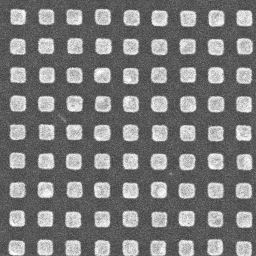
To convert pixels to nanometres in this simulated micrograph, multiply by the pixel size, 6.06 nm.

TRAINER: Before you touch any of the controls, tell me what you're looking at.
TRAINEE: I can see a regular array of raised bodies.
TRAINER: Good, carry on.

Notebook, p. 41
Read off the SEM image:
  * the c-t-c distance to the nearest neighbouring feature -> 170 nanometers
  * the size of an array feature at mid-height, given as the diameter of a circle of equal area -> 99.6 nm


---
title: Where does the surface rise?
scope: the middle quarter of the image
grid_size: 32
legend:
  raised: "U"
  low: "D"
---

DDDDDDDDDDDDDDDDDDDDDDDDDDDDDDDD
DUUUDDDDUUUDDDDUUUDDDDUUUDDDDUUU
DUUUDDDDUUUDDDDUUUDDDDUUUDDDDUUU
DUUUDDDDUUUDDDDUUUDDDDUUUDDDDUUU
DUUUDDDDUUUDDDDUUUDDDDUUUDDDDDDD
DDDDDDDDDDDDDDDDDDDDDDDDDDDDDDDD
DDDDDDDDDDDDDDDDDDDDDDDDDDDDDDDD
DDDDDDDDDDDDDDDDDDDDDDDDDDDDDDDD
DUUUDDDDUUUDDDDUUUDDDDUUUDDDDDUU
DUUUUDDDUUUDDDDUUUDDDDUUUUDDDUUU
DUUUDDDDUUUUDDDUUUDDDDUUUUDDDUUU
DUUUDDDDUUUDDDDUUUDDDDUUUUDDDUUU
DDDDDDDDDDDDDDDDDDDDDDDDDDDDDDDD
DDDDDDDDDDDDDDDDDDDDDDDDDDDDDDDD
DDDDDDDDDDDDDDDDDDDDDDDDDDDDDDDD
DUUUDDDDUUUDDDDUUUDDDDUUUDDDDUDD
DUUUDDDDUUUDDDDUUUDDDDUUUUDDDUUU
DUUUDDDDUUUDDDDUUUDDDDUUUUDDDUUU
DUUUDDDDUUUDDDDUUUDDDDUUUUDDDUUU
DDDDDDDDDDDDDDDDDDDDDDDDDDDDDDDD
DDDDDDDDDDDDDDDDDDDDDDDDDDDDDDDD
DDDDDDDDDDDDDDDDDDDDDDDDDDDDDDDD
DDDDDDDDDDDDDDDUDDDDDDDDDDDDDDDD
DUUUDDDDUUUDDDDUUUDDDDUUUUDDDUUU
DUUUDDDDUUUDDDDUUUDDDDUUUUDDDUUU
DUUUDDDDUUUDDDDUUUDDDDUUUUDDDUUU
DDDDDDDDDDDDDDDDDDDDDDDDDDDDDDDD
DDDDDDDDDDDDDDDDDDDDDDDDDDDDDDDD
DDDDDDDDDDDDDDDDDDDDDDDDDDDDDDDD
DDDDDDDDDDDDDDDDDDDDDDDDDDDDDDDD
DUUUDDDDUUUDDDDUUUDDDDUUUUDDDUUU
DUUUDDDDUUUDDDDUUUDDDDUUUUDDDUUU